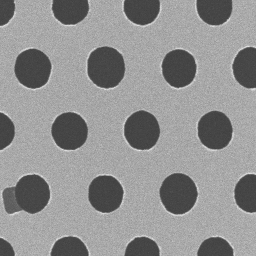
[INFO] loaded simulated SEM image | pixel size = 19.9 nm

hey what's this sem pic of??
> a regular array of holes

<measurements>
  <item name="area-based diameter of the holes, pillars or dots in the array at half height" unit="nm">756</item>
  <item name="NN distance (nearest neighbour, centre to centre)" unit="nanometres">1440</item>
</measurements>